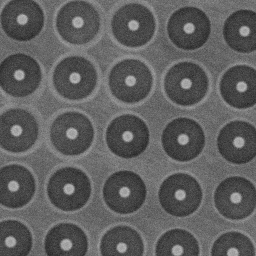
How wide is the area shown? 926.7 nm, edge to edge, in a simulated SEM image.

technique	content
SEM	an array of small figures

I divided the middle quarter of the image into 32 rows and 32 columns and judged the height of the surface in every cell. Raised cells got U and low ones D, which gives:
DDDDDDDDUUUUDDDDDDDDDUUUUUUDDDDD
DDDDDDDDDUUDDDDDDDDDDDUUUUDDDDDD
DDUDDDDDDUUDDDDDDDDDDDUUUDDDDDDD
DDUUDDDDDUUDDDDDUUDDDDDUUDDDDDDD
DDUUDDDDDUDDDDDUUUDDDDDUUDDDDUUU
DDDDDDDDDUUDDDDDUDDDDDUUUDDDDUUU
DDDDDDDDUUUDDDDDDDDDDDUUUDDDDDDD
DDDDDDDUUUUDDDDDDDDDDUUUUDDDDDDD
DDDDDDUUUUUUDDDDDDDDDUUUUUDDDDDD
UUDUUUUUUUUUUDDDDDDUUUUUUUUDDDDD
UUUUUUUUUUUUUUUUUUUUUUUUUUUUUDDD
UDUUUUUUUUUUUUUUUUUUUUUUUUUUUUUU
DDDDDUUUUUUUUUDDDUUUUUUUUUUUUUUU
DDDDDDUUUUUUDDDDDDDUUUUUUUUUDDDD
DDDDDDDUUUUDDDDDDDDDUUUUUUDDDDDD
DDDDDDDUUUUDDDDDDDDDDUUUUDDDDDDD
DUUDDDDDUUDDDDDDDDDDDUUUUDDDDDDD
DUUDDDDDUUDDDDDUUDDDDUUUUDDDDDDD
DUUDDDDDUUDDDDDUUDDDDDUUDDDDDUUD
DDDDDDDUUUDDDDDDDDDDDUUUDDDDDUUD
DDDDDDDUUUUDDDDDDDDDDUUUDDDDDDDD
DDDDDDUUUUUDDDDDDDDDUUUUUDDDDDDD
DDDDDUUUUUUUDDDDDDDUUUUUUDDDDDDD
UUUUUUUUUUUUUUDDDUUUUUUUUUDDDDDD
UUUUUUUUUUUUUUUUUUUUUUUUUUUUUDDU
DDDUUUUUUUUUUUUUUUUUUUUUUUUUUUUU
DDDDDUUUUUUUUUUDUUUUUUUUUUUUUUUU
DDDDDDUUUUUUDDDDDDUUUUUUUUUDDDDU
DDDDDDUUUUUDDDDDDDDUUUUUUDDDDDDD
DDDDDDDUUUDDDDDDDDDDUUUUUDDDDDDD
UUDDDDDUUUDDDDDDDDDDUUUUDDDDDDDD
UUUDDDDUUDDDDDUUDDDDDUUUDDDDDDDD